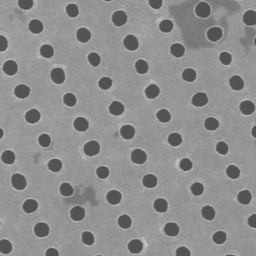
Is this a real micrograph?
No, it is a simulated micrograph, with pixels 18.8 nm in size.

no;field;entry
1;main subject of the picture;a regular array of holes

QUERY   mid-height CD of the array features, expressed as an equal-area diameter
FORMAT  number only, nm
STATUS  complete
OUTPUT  273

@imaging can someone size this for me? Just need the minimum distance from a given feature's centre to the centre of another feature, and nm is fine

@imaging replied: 501